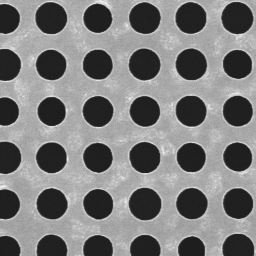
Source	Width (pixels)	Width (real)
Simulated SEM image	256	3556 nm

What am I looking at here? a regular array of holes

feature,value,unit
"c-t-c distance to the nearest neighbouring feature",0.638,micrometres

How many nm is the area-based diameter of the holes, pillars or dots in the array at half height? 428